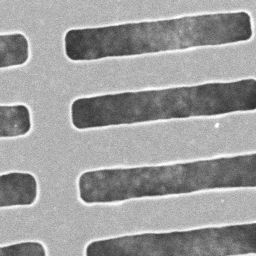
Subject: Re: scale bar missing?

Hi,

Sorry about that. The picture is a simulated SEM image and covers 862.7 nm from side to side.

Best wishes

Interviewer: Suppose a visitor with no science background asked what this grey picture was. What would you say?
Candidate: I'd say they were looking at holes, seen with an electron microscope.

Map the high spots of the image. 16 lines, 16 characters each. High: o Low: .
oooooooooooooooo
oooooooo........
..oo...........o
..oo....oooooooo
oooooooooooooooo
oooooooooo......
ooooo...........
..ooo.....oooooo
.ooooooooooooooo
oooooooooooooooo
ooooooo.........
..ooo...........
..ooo...oooooooo
oooooooooooooooo
oooooooooo......
...oo...........